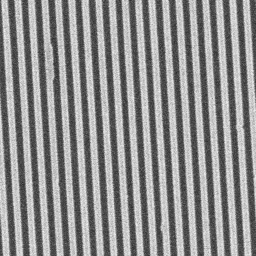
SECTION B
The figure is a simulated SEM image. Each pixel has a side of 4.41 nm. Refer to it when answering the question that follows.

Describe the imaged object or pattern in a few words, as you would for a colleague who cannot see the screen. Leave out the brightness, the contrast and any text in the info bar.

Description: parallel lines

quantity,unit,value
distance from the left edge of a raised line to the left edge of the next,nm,59.1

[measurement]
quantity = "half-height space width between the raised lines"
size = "32.5 nanometers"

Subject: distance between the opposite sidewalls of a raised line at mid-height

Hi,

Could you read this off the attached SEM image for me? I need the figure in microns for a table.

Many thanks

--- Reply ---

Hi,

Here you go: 0.0242